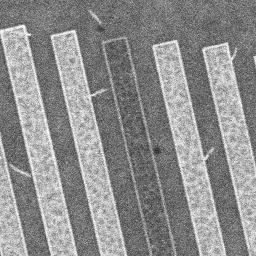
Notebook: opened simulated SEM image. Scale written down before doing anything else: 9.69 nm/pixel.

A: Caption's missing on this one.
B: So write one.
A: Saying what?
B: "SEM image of parallel lines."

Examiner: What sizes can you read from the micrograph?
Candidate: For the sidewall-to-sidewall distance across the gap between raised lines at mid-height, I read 240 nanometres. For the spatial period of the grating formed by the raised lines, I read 473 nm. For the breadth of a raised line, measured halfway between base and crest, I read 232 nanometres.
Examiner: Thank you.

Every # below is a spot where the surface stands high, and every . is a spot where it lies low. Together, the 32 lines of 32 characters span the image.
................................
................................
................................
..#.............................
###....##.......................
.##....###...###....##..........
.###...###...###...###....###...
.###...###...###....###...###...
.###...###....###...###...###...
.###....###...###...###...###...
..###...###...###...###...###...
..###...###...###....##....###..
..###...###...####...###...###..
..###....###...###...###...###..
...##....###...###...###...###..
...###...###...###...###....###.
...###...###...###....###...###.
...###...###....###...###...###.
...###....###...###...###...###.
#...###...###...###...###...####
#...###...###...###....###...###
#...###...###....###...###...###
#...###....###...###...###...###
#....###...###...###...###...###
##...###...###...###...###....##
##...###...###...####...###...##
##...###...###....###...###...##
##....##....###...###...###...##
###...###...###...###...###....#
###...###...###...###....###...#
###...###...###....###...###...#
###...###....###...###...###...#